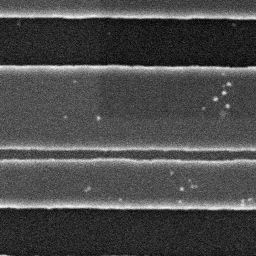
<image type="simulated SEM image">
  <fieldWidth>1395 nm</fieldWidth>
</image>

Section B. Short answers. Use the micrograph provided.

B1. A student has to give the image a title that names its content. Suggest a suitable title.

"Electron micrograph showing lines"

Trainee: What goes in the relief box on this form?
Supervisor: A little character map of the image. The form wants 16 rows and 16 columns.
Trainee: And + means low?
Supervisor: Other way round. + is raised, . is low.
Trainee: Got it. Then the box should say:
++++++++++++++++
................
................
................
++++++++++++++++
++++++++++++++++
++++++++++++++++
++++++++++++++++
++++++++++++++++
++++++++++++++++
++++++++++++++++
++++++++++++++++
++++++++++++++++
................
................
................